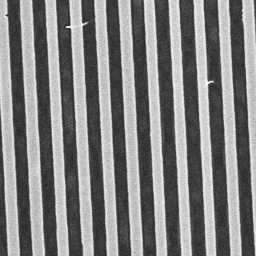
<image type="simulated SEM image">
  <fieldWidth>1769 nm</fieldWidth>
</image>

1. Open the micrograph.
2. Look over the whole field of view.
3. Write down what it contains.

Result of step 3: parallel lines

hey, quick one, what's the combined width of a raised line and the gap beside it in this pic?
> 0.17 µm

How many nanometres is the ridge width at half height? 74.1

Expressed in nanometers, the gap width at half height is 99.1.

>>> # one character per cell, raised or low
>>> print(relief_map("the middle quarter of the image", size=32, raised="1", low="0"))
00111000011000011000011000011000
00111000011000011000011000011100
00111000011000011000011000011100
00011000011000011000011000011000
00011000011000011000011000011000
00011000011000011000011000001100
00011000011000011000011100001100
00011000011100011100011100011100
00011000011100011100011100011100
00011000011100011100011100001100
00011000011100011100011100001100
00011000011100011100001100001100
00011000011100011100001100001100
00011100011100011100001100001100
00011100011100011100001100001100
00011100011100011100001100001100
00011100011100011100001100001100
00011100011100011100001100001100
00011100011100011100001100001100
00011100001100011100001100001100
00011100011100001100001100001110
00011100001100001100001100001110
00001100001100001100001100001110
00001100001100001100001100001100
00001100001100001100001100001110
00001100001100001100001110001110
00001100001100001110001110000110
00001100001100001110001110000110
00001100001110001110001110000110
00001100001110001110001110000110
00001100001110001110000110000110
00001100001110001110000110000110